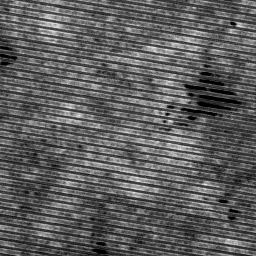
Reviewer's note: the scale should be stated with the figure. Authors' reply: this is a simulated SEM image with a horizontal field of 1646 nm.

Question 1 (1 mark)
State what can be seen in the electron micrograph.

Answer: parallel lines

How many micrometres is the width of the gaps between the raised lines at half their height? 0.0199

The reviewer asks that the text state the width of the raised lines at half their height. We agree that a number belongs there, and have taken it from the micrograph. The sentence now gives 29.3 nm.